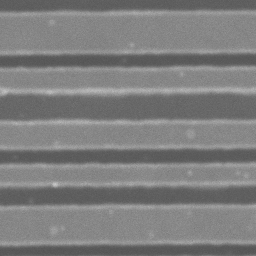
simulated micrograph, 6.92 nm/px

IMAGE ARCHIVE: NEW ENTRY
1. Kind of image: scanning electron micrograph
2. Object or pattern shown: lines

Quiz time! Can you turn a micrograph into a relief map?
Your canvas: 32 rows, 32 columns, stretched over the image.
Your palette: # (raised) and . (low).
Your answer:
................................
.........................#......
################################
################################
################################
################################
#######################.######..
................................
.....................######.####
################################
################################
#.....#.........................
................................
................................
................................
################################
################################
################################
#############.###...............
................................
................................
################################
################################
................................
................................
................................
################################
################################
################################
################################
############..####..............
................................